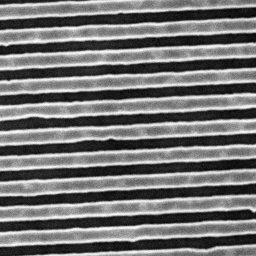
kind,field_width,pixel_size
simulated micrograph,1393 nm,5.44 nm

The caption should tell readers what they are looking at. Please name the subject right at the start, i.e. parallel lines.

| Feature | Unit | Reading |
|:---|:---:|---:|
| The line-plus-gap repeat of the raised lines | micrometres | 0.137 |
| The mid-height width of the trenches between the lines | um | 0.0632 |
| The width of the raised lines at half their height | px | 13.4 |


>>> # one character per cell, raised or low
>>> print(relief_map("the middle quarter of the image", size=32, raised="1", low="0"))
00000000000000000000000000000000
00000000000000000000000000000000
00000000000000000000000011111111
00101111111111111111111111111111
11111111111111111111111111111111
11111111111111111111111110000000
11111100000000000000000000000000
00000000000000000000000000000000
00000000000000000000000001111111
00000000011111111111111111111111
11111111111111111111111111111111
11111111111111111111111111111111
11111111111000000000000000000000
00000000000000000000000000000000
00000000000000000000000000000000
00000000000000000111111111111111
11111111111111111111111111111111
11111111111111111111111111111111
11111111111011111111000000000000
00000000000000000000000000000000
00000000000000000000000000000000
00000000000000000000001111111111
00111111111111111111111111111111
11111111111111111111111111111111
11111111111111111111111110000000
11111100000000000000000000000000
00000000000000000000000000000000
00000000000000000000000000011111
00000001111111111111111111111111
11111111111111111111111111111111
11111111111111111111111111111111
11111111110000000000000000000000